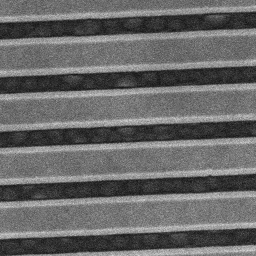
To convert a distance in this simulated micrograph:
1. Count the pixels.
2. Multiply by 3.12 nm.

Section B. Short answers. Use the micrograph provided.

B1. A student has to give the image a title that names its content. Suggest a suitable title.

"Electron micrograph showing parallel lines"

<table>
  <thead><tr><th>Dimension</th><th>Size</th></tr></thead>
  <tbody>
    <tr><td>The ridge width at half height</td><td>98.5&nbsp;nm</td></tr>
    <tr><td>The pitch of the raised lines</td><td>0.168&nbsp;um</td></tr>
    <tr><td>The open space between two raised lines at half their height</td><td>69.7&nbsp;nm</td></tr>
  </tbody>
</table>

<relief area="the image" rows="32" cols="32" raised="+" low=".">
++++++++++++++++++++++++++++++++
++++++++++++++++++++..+.........
................................
................................
....................++++++++++++
++++++++++++++++++++++++++++++++
++++++++++++++++++++++++++++++++
++++++++++++++++++++++++++++++++
+++++++++++++++++...............
................................
................................
...............+++++++++++++++++
++++++++++++++++++++++++++++++++
++++++++++++++++++++++++++++++++
++++++++++++++++++++++++++++++++
++++++++++++....................
................................
................................
.........+++++++++++++++++++++++
++++++++++++++++++++++++++++++++
++++++++++++++++++++++++++++++++
+++++++++++++++++++++++++++++...
++++++..........................
................................
..........................++++++
....++++++++++++++++++++++++++++
++++++++++++++++++++++++++++++++
++++++++++++++++++++++++++++++++
++++++++++++++++++++++++........
+...............................
................................
.....................+++++++++++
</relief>